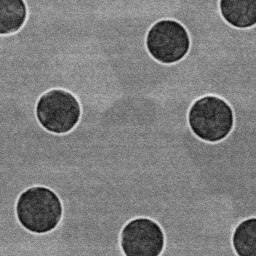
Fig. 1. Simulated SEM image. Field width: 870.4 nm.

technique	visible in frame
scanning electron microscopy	holes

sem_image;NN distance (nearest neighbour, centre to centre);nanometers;321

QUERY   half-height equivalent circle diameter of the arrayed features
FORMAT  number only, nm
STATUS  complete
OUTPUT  154